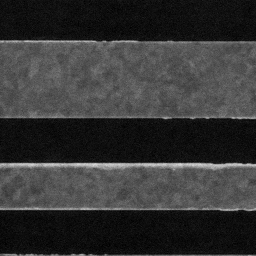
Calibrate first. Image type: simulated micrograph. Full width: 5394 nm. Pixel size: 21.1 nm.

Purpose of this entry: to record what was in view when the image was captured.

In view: lines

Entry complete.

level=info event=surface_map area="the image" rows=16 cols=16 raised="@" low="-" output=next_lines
----------------
----------------
----------------
@@@@@@@@@@@@@@@@
@@@@@@@@@@@@@@@@
@@@@@@@@@@@@@@@@
@@@@@@@@@@@@@@@@
----------------
----------------
----------------
@@@@@@@@@@@@@@@@
@@@@@@@@@@@@@@@@
@@@@@@@@@@@@@@@@
----------------
----------------
----------------